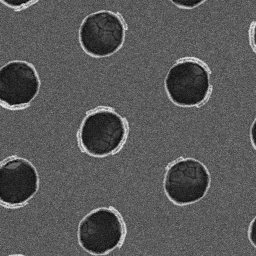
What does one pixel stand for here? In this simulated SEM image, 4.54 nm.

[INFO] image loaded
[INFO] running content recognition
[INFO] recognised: holes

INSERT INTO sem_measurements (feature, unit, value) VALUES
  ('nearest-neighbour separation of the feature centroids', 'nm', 445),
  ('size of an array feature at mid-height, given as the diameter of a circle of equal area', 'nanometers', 202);